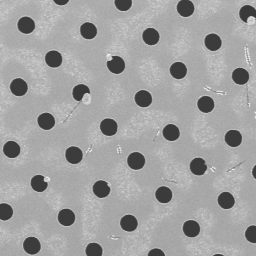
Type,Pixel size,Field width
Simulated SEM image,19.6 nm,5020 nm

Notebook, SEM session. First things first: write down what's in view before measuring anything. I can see a regular array of holes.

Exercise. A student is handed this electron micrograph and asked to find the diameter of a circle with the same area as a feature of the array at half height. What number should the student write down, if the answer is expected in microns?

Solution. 0.332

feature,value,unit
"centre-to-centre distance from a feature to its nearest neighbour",855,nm